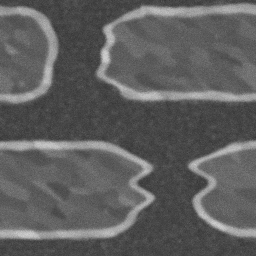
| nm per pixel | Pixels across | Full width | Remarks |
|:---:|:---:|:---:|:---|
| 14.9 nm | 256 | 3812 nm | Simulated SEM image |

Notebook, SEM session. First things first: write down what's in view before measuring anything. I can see one or a few lines or trenches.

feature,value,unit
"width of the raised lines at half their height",1290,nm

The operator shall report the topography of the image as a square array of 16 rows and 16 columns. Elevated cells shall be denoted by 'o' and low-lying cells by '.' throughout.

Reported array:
................
ooo....ooooooooo
ooo....ooooooooo
ooo....ooooooooo
ooo...oooooooooo
ooo.....oooooooo
................
................
................
oooooooo......oo
ooooooooo...oooo
ooooooooo....ooo
ooooooooo...oooo
oooooooo.....ooo
ooooooo........o
................